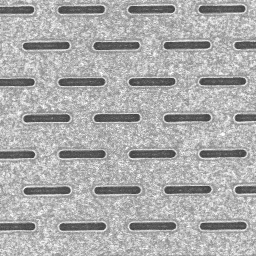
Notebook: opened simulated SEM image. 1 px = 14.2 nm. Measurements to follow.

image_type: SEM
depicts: a regular array of holes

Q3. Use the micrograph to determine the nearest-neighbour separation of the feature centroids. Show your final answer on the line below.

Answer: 710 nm